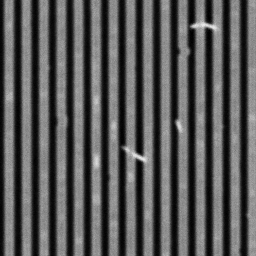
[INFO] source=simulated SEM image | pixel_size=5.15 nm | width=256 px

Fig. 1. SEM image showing parallel lines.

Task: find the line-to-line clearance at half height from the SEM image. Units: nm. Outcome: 44.4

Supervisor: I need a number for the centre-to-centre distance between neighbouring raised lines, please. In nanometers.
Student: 89.5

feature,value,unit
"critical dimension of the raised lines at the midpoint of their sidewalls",44.4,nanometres